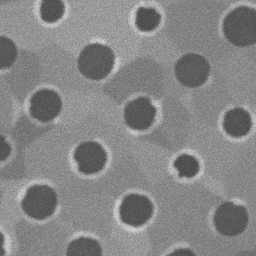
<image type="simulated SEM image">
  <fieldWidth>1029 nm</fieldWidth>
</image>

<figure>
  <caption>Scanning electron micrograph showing a regular array of holes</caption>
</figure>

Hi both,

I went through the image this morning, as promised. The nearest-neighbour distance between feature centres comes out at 66.4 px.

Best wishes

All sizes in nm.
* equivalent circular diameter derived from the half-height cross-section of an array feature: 135